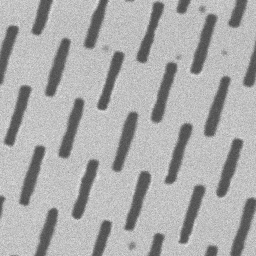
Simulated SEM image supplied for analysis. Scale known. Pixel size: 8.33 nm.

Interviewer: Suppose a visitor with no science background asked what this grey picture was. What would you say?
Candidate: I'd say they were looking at a regular array of holes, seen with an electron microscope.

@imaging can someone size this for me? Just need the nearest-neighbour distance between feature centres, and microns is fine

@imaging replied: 0.455